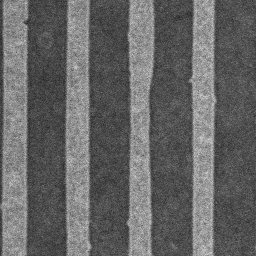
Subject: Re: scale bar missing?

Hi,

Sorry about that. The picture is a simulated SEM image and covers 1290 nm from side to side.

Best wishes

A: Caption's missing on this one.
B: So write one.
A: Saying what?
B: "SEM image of one or a few lines or trenches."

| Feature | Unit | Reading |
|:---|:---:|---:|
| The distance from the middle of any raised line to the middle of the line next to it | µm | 0.316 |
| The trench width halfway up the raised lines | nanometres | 213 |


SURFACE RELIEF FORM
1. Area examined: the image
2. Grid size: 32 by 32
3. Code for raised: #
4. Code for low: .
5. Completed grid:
.##......##.....###.....###.....
.##......##.....###.....###.....
.##......##.....###.....###.....
.##......##.....###.....###.....
.##......##.....###.....###.....
.##......##.....###.....##......
.##......##.....###.....##......
.##......##.....###.....##......
.##......##.....###.....##......
.##......##.....###.....##......
.##......##.....###.....###.....
.##......##......#......###.....
.##......##......#......###.....
.##.....###......#......###.....
.##.....###......##.....###.....
.##.....###......#......###.....
.##.....###.....##......###.....
.##.....###.....##......###.....
.##.....###.....##......###.....
.##.....###.....###.....###.....
###.....###.....###.....###.....
###.....###.....###.....###.....
###.....###.....###.....###.....
###.....###.....###.....##......
###.....###.....###.....##......
###.....###.....###.....##......
###.....###.....###.....##......
###......##.....###.....##......
###......##.....###.....##......
###......##.....###.....##......
###......##.....###.....##......
###......##.....###.....##......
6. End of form